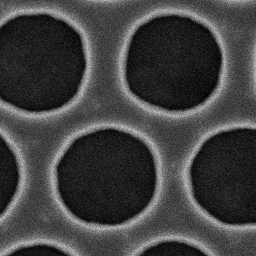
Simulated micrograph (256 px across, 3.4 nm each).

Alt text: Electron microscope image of holes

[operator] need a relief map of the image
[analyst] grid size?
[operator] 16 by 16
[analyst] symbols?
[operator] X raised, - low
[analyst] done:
XXXXXXXXXXXXXXXX
----XXXXX----XXX
-----XXX------XX
-----XXX------XX
-----XXX------XX
-----XXX------XX
----XXXXX----XXX
XXXXXXXXXXXXXXXX
XXXXX----XXXX---
-XXX------XX----
-XX-------XX----
-XX-------XX----
-XXX------XX----
XXXXX----XXXX---
XXXXXXXXXXXXXXXX
X---XXXXX---XXXX